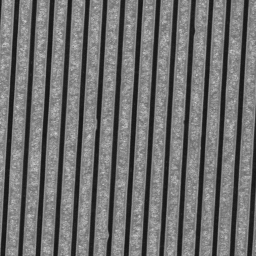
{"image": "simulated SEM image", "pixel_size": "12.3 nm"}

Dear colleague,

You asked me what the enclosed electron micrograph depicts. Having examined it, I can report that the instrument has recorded parallel lines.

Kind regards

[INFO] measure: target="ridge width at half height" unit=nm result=158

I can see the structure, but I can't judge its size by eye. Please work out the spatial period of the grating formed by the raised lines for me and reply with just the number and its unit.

217 nm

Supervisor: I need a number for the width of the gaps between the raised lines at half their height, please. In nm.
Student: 53.9